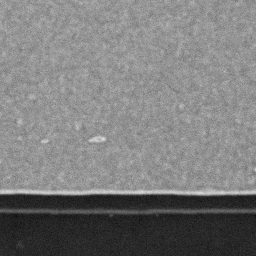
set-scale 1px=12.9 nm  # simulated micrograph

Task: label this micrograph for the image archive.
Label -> wiring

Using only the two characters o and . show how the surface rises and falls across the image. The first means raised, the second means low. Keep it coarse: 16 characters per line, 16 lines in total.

oooooooooooooooo
oooooooooooooooo
oooooooooooooooo
oooooooooooooooo
oooooooooooooooo
oooooooooooooooo
oooooooooooooooo
oooooooooooooooo
oooooooooooooooo
oooooooooooooooo
oooooooooooooooo
oooooooooooooooo
................
................
................
................